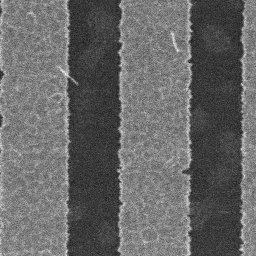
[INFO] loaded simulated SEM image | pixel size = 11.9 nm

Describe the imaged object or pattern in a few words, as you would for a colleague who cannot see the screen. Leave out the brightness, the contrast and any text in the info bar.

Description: one or a few lines or trenches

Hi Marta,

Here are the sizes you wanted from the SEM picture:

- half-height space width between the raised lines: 632 nanometers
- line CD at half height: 806 nm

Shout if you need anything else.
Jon